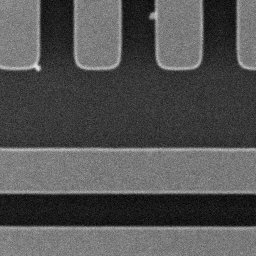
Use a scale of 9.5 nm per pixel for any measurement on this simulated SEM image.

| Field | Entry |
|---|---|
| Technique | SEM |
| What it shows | groups of lines, slits or small figures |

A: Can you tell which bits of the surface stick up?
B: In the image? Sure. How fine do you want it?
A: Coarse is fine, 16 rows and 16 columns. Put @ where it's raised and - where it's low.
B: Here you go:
@@---@@@--@@@--@
@@---@@@--@@@--@
@@---@@@--@@@--@
@@---@@---@@@--@
----------------
----------------
----------------
----------------
----------------
@@@@@@@@@@@@@@@@
@@@@@@@@@@@@@@@@
@@@@@@@@@@@@@@@@
----------------
----------------
@@@@@@@@@@@@@@@@
@@@@@@@@@@@@@@@@